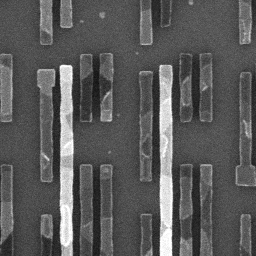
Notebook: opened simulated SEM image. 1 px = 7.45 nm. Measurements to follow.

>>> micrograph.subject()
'wiring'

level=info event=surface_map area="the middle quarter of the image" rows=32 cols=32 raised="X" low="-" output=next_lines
X---XXX--XXX------------XXX--XXX
XX--XXX--XXX------------XXX--XXX
XX--XXX--XXX-------XXX--XXX--XXX
XX--XXX--XXX-------XXX--XXX--XXX
XX--XXX--XXX-------XXX--XXX--XXX
XX--XXX--XXX-------XXX--XXX--XXX
XX--XXX--XXX-------XXX--XXX--XXX
XX--XXX--XXX-------XXX--XXX--XXX
XX--XXX--XXX-------XXX--XXX--XXX
XX--XXX--XXX-------XXX--XXX--XXX
XX--XXX--XXX-------XXX--XXX--XXX
XX--XXX--XXX-------XXX--XXX--XXX
XX--XXX--XXX-------XXX--XXX--XXX
XX--XXX--XXX-------XXX--XXX--XXX
XX-----------------XXX--XXX-----
XX-----------------XXX--XXX-----
XX-----------------XXX--XXX-----
XX-----------------XXX--XXX-----
XX-----------------XXX--XXX-----
XX-----------------XXX--XXX-----
XX-----------------XXX--XXX-----
XX-----------------XXX--XXX-----
XX-----------------XXX--XXX-----
XX-----------------XXX--XXX-----
XX-----------------XXX--XXX-----
XX--XXX--XXX-------XXX--XXX--XXX
XX--XXX--XXX-------XXX--XXX--XXX
XX--XXX--XXX-------XXX--XXX--XXX
XX--XXX--XXX-------XXX--XXX--XXX
XX--XXX--XXX------------XXX--XXX
XX--XXX--XXX------------XXX--XXX
XX--XXX--XXX------------XXX--XXX